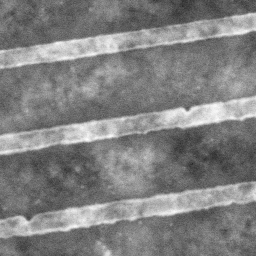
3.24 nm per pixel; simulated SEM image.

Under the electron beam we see one or a few lines or trenches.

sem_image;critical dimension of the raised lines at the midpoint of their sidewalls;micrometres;0.0573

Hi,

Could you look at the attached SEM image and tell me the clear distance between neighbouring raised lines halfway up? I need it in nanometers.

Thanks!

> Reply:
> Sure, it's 214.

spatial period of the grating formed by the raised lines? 0.272 microns